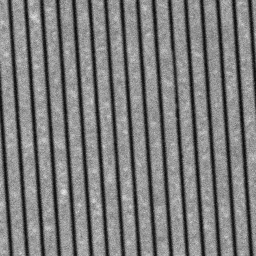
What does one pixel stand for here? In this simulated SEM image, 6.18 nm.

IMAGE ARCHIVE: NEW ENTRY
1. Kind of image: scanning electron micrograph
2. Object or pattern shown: parallel lines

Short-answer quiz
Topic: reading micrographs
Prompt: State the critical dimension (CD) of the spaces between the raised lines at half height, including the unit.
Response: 21.6 nm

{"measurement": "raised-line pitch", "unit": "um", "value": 0.0987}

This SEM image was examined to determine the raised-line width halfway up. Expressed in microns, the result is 0.0755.